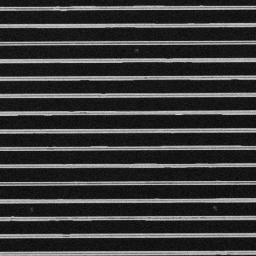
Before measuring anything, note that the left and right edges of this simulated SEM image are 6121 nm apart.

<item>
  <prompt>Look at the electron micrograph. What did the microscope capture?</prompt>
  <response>parallel lines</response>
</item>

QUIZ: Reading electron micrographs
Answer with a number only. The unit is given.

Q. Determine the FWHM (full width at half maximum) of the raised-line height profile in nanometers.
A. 65.8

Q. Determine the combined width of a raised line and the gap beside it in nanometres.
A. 419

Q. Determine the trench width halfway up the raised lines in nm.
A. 359